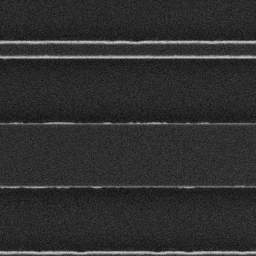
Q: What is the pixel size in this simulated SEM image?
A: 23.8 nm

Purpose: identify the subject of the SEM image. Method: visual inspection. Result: lines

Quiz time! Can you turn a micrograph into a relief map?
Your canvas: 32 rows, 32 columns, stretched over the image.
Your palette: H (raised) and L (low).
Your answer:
LLLLLLLLLLLLLLLLLLLLLLLLLLLLLLLL
LLLLLLLLLLLLLLLLLLLLLLLLLLLLLLLL
LLLLLLLLLLLLLLLLLLLLLLLLLLLLLLLL
LLLLLLLLLLLLLLLLLLLLLLLLLLLLLLLL
LLLLLLLLLLLLLLLLLLLLLLLLLLLLLLLL
HHHHHHHHHHHHHHHHHHHHHHHHHHHHHHHH
HHHHHHHHHHHHHHHHHHHHHHHHHHHHHHHH
LLLLLLLLLLLLLLLLLLLLLLLLLLLLLLLL
LLLLLLLLLLLLLLLLLLLLLLLLLLLLLLLL
LLLLLLLLLLLLLLLLLLLLLLLLLLLLLLLL
LLLLLLLLLLLLLLLLLLLLLLLLLLLLLLLL
LLLLLLLLLLLLLLLLLLLLLLLLLLLLLLLL
LLLLLLLLLLLLLLLLLLLLLLLLLLLLLLLL
LLLLLLLLLLLLLLLLLLLLLLLLLLLLLLLL
LLLLLLLLLLLLLLLLLLLLLLLLLLLLLLLL
HHHHHHHHHHHHHHHHHHHHHHHHHHHHHHHH
HHHHHHHHHHHHHHHHHHHHHHHHHHHHHHHH
HHHHHHHHHHHHHHHHHHHHHHHHHHHHHHHH
HHHHHHHHHHHHHHHHHHHHHHHHHHHHHHHH
HHHHHHHHHHHHHHHHHHHHHHHHHHHHHHHH
HHHHHHHHHHHHHHHHHHHHHHHHHHHHHHHH
HHHHHHHHHHHHHHHHHHHHHHHHHHHHHHHH
HHHHHHHHHHHHHHHHHHHHHHHHHHHHHHHH
LLLLLLLLLLLLLLLLLLLLLLLLLLLLLLLL
LLLLLLLLLLLLLLLLLLLLLLLLLLLLLLLL
LLLLLLLLLLLLLLLLLLLLLLLLLLLLLLLL
LLLLLLLLLLLLLLLLLLLLLLLLLLLLLLLL
LLLLLLLLLLLLLLLLLLLLLLLLLLLLLLLL
LLLLLLLLLLLLLLLLLLLLLLLLLLLLLLLL
LLLLLLLLLLLLLLLLLLLLLLLLLLLLLLLL
LLLLLLLLLLLLLLLLLLLLLLLLLLLLLLLL
LLLLLLLLLLLHHLLLLHLLLLLLLLLLHLLL